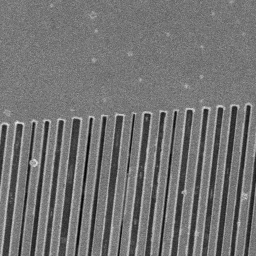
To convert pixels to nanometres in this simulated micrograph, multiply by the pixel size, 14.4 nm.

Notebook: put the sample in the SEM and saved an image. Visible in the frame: parallel lines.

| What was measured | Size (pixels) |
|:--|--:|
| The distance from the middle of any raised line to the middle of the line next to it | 14.1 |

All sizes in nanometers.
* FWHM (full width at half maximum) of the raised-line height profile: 115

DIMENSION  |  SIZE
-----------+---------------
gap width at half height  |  85.9 nm